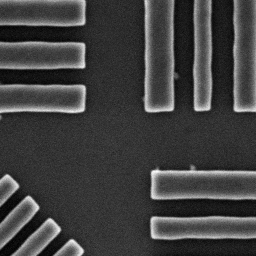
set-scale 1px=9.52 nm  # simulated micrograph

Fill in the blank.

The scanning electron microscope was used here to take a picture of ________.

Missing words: groups of lines, slits or small figures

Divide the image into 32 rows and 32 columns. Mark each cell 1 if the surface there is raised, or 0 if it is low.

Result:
11111111111000000011110011000111
11111111110000000011110011000111
11111111110000000011110011000111
00000000000000000011110011000111
00000000000000000011110011000111
11111111110000000011110011000111
11111111110000000011110011000111
11111111110000000011110011000111
00111000000000000011110011000111
00000000000000000011110011000111
00000000000000000011110011000111
11111111111000000011110011000111
11111111111000000011110011000111
11111111110000000011110011000111
00000000000000000000000000000000
00000000000000000000000000000000
00000000000000000000000000000000
00000000000000000000000000000000
00000000000000000000000000000000
00000000000000000000000000000000
00000000000000000000000000000000
00000000000000000001111111111111
11000000000000000001111111111111
11000000000000000001111111111111
10000000000000000001111111111111
00111000000000000000000000000000
01110000000000000000000000000000
11110000000000000001111111111111
11100110000000000001111111111111
11001110000000000001111111111111
10011100110000000000000000000000
00111001110000000000000000000000